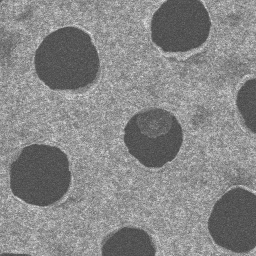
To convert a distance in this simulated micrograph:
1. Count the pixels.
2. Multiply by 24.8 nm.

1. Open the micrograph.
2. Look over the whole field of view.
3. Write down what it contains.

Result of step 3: holes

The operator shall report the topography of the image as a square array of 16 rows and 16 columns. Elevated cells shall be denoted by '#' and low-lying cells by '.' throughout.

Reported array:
##########...###
#########....###
###...####...###
##....##########
##....##########
###...#########.
###############.
########...####.
########...#####
#...####...#####
#...############
#...############
#...##########..
#############...
#######..####...
######....####..